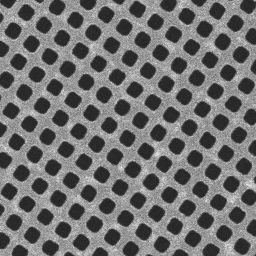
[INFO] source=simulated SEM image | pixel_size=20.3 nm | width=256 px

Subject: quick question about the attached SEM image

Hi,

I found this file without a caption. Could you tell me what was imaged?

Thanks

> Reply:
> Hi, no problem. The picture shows a regular array of holes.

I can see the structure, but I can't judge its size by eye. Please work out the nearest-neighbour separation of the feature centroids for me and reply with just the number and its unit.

21.9 pixels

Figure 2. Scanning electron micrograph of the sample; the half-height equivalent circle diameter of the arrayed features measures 16.2 pixels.